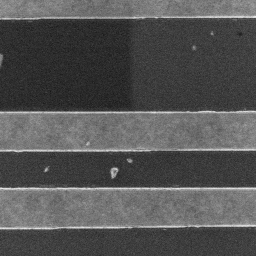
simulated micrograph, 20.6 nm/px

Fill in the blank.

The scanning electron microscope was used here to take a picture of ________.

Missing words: lines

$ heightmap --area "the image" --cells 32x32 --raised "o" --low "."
oooooooooooooooooooooooooooooooo
oooooooooooooooooooooooooooooooo
................................
................................
................................
................................
................................
................................
................................
................................
................................
................................
................................
................................
oooooooooooooooooooooooooooooooo
oooooooooooooooooooooooooooooooo
oooooooooooooooooooooooooooooooo
oooooooooooooooooooooooooooooooo
oooooooooooooooooooooooooooooooo
................................
................................
................................
................................
................................
oooooooooooooooooooooooooooooooo
oooooooooooooooooooooooooooooooo
oooooooooooooooooooooooooooooooo
oooooooooooooooooooooooooooooooo
ooooooo.........................
................................
................................
................................